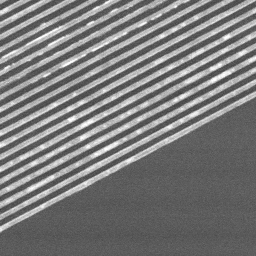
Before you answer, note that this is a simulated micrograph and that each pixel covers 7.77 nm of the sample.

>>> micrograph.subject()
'parallel lines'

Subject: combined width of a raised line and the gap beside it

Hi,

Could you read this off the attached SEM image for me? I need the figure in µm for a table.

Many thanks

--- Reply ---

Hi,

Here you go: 0.0824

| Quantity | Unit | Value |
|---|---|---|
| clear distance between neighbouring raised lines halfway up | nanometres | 51.5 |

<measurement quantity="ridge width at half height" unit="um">0.0369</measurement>